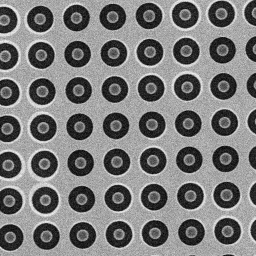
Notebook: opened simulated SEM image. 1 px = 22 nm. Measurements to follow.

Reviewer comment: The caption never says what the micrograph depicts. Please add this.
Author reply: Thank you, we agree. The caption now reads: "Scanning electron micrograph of an array of small figures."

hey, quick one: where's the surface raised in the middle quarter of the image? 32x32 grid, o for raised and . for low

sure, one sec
oo...oooooo...ooooooo.oooooooooo
oooooooooooooooooooooooooooooooo
oooooooooooooooooooooooooooooo..
oo...oooooo....oooo.....oooo....
o.....oooo......ooo......oo.....
o......oo.......oo.......oo.....
.......oo.......oo.......oo.....
.......ooo......ooo......ooo....
o.....oooo.....oooo.....ooooo...
oo...ooooooo..ooooooo.oooooooooo
oooooooooooooooooooooooooooooooo
oooooooooooooooooooooooooooooooo
ooo..oooooo....ooooo....ooooo...
o.....oooo......ooo......ooo....
o......ooo......ooo......ooo....
.......ooo......ooo.......oo....
o......ooo......ooo......ooo....
o......ooo......oooo.....oooo...
oo....oooooo..ooooooo..ooooooooo
oooooooooooooooooooooooooooooooo
oooooooooooooooooooooooooooooooo
ooo..ooooooo...ooooo....ooooo...
oo.....ooo......ooo......ooo....
o......ooo.......oo.......oo....
o.......oo.......oo.......oo....
o.......oo.......oo......ooo....
o......ooo......oooo.....oooo...
oo....ooooo....oooooo..ooooooooo
oooooooooooooooooooooooooooooooo
oooooooooooooooooooooooooooooooo
oooo.ooooooo...ooooo....ooooo...
oo.....oooo.....ooo......ooo....